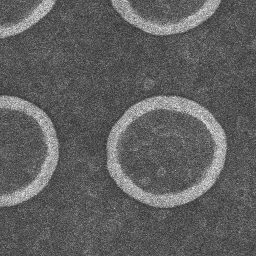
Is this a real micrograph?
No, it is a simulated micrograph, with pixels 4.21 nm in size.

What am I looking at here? raised bodies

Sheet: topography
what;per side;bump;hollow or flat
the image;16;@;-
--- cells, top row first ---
@@@-----@@@@@---
@@-------@@@----
----------------
----------------
----------------
----------------
@--------@@@----
@@@-----@@@@@---
@@@----@@@@@@@--
@@@----@@@@@@@--
@@@----@@@@@@@--
@@------@@@@@---
@--------@@-----
----------------
----------------
----------------